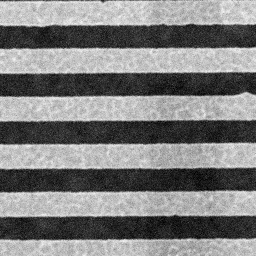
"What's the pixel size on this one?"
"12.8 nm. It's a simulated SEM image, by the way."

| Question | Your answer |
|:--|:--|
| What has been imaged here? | parallel lines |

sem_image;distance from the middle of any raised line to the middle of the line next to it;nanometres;609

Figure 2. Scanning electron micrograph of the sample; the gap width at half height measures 0.31 microns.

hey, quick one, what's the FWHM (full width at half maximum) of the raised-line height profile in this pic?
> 0.301 µm